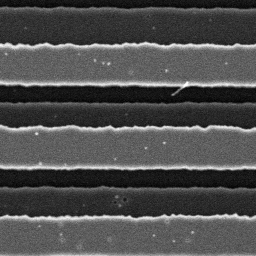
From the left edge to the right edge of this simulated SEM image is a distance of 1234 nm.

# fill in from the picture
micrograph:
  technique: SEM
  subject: lines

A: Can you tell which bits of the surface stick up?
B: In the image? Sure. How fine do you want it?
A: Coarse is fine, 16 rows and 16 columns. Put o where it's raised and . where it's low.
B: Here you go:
................
................
................
oooooooooooooooo
oooooooooooooooo
................
................
................
oooooooooooooooo
oooooooooooooooo
oooooooooooooooo
................
................
o.....o...ooooo.
oooooooooooooooo
oooooooooooooooo